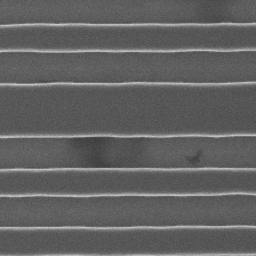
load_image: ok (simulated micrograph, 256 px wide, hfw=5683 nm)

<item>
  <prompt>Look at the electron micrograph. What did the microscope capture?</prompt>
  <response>wiring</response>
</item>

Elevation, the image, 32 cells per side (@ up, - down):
--------------------------------
--------------------------------
--------------------------------
@@@@@@@@@@@@@@@@@@@@@@@@@@@@@@@@
@@@@@@@@@@@@@@@@@@@@@@@@@@@@@@@@
@@@@@@@@@@@@@@@@@@@@@@@@@@@@@@@@
--------------------------------
--------------------------------
--------------------------------
--------------------------------
@@--@@@@@@@@@@@@@@@@@@@@@@@@@@@@
@@@@@@@@@@@@@@@@@@@@@@@@@@@@@@@@
@@@@@@@@@@@@@@@@@@@@@@@@@@@@@@@@
@@@@@@@@@@@@@@@@@@@@@@@@@@@@@@@@
@@@@@@@@@@@@@@@@@@@@@@@@@@@@@@@@
@@@@@@@@@@@@@@@@@@@@@@@@@@@@@@@@
@@@@@@@@@@@@@@@@@@@@@@@@@@@@@@@@
--------------------------------
--------------------------------
--------------------------------
--------------------------------
@@@@@@@@@@@@@@@@@@@@@@@@@@@@@@@@
@@@@@@@@@@@@@@@@@@@@@@@@@@@@@@@@
@@@@@@@@@@@@@@@@@@@@@@@@@@@@@@@@
-@@------@@@--------------------
--------------------------------
--------------------------------
--------------------------------
@@@@@@@@@@@@@@@@@@@@@@@@@@@@@@@@
@@@@@@@@@@@@@@@@@@@@@@@@@@@@@@@@
@@@@@@@@@@@@@@@@@@@@@@@@@@@@@@@@
@@@@@@@@@@@@@@@@@@@@@@@@@@@@@@@@